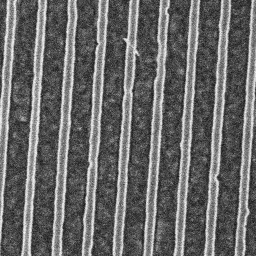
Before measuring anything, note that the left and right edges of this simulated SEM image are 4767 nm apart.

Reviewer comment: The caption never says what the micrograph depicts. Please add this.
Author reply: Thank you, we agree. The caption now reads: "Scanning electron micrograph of parallel lines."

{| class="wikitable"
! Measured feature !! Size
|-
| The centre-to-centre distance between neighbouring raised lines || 568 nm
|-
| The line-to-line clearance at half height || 0.416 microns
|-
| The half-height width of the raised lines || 144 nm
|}